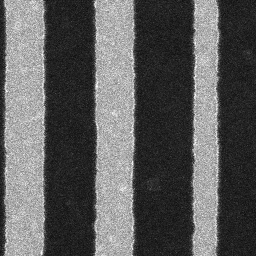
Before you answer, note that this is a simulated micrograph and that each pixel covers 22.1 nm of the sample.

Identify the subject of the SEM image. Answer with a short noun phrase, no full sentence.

one or a few lines or trenches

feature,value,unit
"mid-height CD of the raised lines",1290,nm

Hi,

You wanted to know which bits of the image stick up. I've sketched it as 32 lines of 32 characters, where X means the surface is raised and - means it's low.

X----XXXXXXX-----XXXXXXX---XXXXX
X----XXXXXXX-----XXXXXXX---XXXXX
X----XXXXXXX-----XXXXXXX---XXXXX
X----XXXXXXX-----XXXXXXX---XXXXX
X----XXXXXXX-----XXXXXXX---XXXXX
X----XXXXXXX-----XXXXXXX---XXXXX
X----XXXXXXX-----XXXXXXX---XXXXX
X----XXXXXXX-----XXXXXXXX--XXXXX
X----XXXXXXX-----XXXXXXX---XXXXX
X----XXXXXXX-----XXXXXXX---XXXXX
X----XXXXXXX-----XXXXXXX---XXXXX
X----XXXXXXX-----XXXXXXX---XXXXX
X----XXXXXXX-----XXXXXXX---XXXXX
X----XXXXXXX-----XXXXXXX---XXXXX
X----XXXXXXX-----XXXXXXX---XXXXX
X----XXXXXXX-----XXXXXXX---XXXXX
X----XXXXXXX-----XXXXXXX---XXXXX
X----XXXXXXX-----XXXXXXX---XXXXX
X----XXXXXXX-----XXXXXXX---XXXXX
X----XXXXXXX-----XXXXXXX---XXXXX
X----XXXXXXX-----XXXXXXX---XXXXX
X----XXXXXXX-----XXXXXXX---XXXXX
X----XXXXXXX----XXXXXXXX---XXXXX
X----XXXXXXX----XXXXXXXX---XXXXX
X----XXXXXXX----XXXXXXXX---XXXXX
X----XXXXXXX----XXXXXXXX---XXXXX
X----XXXXXXX----XXXXXXXX---XXXXX
X----XXXXXXX-----XXXXXXX---XXXXX
X----XXXXXXX-----XXXXXXX---XXXXX
X----XXXXXXX-----XXXXXXX---XXXXX
X----XXXXXXX-----XXXXXXX---XXXXX
X----XXXXXXX----XXXXXXXX---XXXXX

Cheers